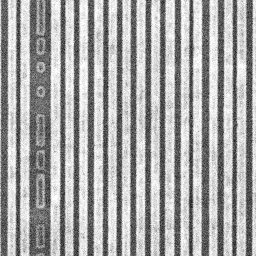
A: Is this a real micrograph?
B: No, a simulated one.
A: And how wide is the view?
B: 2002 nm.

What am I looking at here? parallel lines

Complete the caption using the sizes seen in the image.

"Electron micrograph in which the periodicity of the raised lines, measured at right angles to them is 112 nm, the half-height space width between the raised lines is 64.5 nm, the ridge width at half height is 6.38 px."